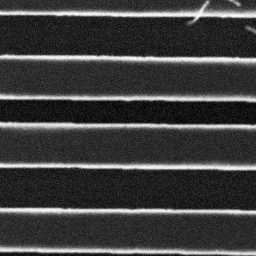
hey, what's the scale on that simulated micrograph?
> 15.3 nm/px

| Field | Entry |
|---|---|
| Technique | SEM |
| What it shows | lines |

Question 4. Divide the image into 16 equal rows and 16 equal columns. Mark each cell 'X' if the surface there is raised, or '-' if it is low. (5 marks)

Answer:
XXXXXXXXXXXXXXXX
----------------
----------------
----------------
XXXXXXXXXXXXXXXX
XXXXXXXXXXXXXXXX
----------------
----------------
XXXXXXXXXXXXXXXX
XXXXXXXXXXXXXXXX
------------XXXX
----------------
----------------
XXXXXXXXXXXXXXXX
XXXXXXXXXXXXXXXX
XXXXXXXXXXXXXXXX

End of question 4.